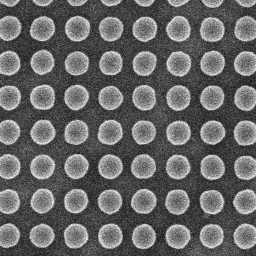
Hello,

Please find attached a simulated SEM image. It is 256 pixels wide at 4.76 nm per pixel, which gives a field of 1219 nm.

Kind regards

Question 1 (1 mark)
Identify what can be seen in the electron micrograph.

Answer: a regular array of raised bodies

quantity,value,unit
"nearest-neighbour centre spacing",160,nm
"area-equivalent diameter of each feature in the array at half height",113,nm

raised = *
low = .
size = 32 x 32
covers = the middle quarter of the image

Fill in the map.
******...*****...******...******
.*****...*****....****....*****.
..**......***......**......***..
................................
................................
..**............................
.****.....****....****....*****.
******...*****...*****....*****.
******...******..******...*****.
******...*****...******...*****.
.****.....****....****....*****.
................................
................................
................................
..***.....***......**...........
.*****...*****...*****....*****.
******...*****...******...*****.
******...*****...******...*****.
******...*****....****....*****.
.****....****.....****.....***..
................................
................................
................................
.****.....***.....****.....***..
******...*****...*****....*****.
******...******..******...*****.
******...*****...******...*****.
.****....*****...*****....*****.
...........*................*...
................................
................................
..**...............**...........